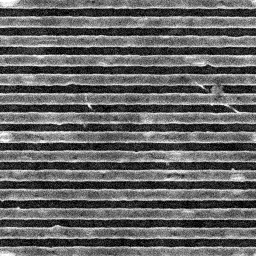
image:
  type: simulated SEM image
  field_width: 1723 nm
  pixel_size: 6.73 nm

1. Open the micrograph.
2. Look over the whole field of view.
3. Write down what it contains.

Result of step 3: parallel lines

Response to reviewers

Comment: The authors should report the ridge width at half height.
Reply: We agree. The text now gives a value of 0.0732 microns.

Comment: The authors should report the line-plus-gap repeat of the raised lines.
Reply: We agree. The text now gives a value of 129 nanometres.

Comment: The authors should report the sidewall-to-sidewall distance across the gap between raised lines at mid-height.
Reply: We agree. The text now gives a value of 58.1 nanometers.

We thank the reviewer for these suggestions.